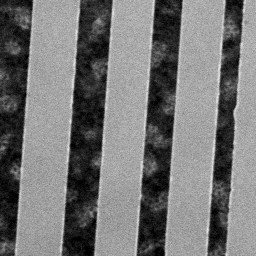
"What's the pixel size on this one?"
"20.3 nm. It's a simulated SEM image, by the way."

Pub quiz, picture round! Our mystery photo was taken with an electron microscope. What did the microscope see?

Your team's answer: one or a few lines or trenches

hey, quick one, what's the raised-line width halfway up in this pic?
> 842 nm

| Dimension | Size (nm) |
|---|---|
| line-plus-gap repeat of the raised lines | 1490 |